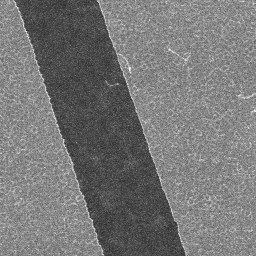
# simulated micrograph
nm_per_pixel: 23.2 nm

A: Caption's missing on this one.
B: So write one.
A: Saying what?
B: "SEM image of one or a few lines or trenches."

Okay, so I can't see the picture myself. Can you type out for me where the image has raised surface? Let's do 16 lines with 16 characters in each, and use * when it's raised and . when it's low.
*.....**********
*......*********
**.....*********
**.....*********
**......********
***.....********
***.....********
***......*******
****.....*******
****.....*******
*****.....******
*****.....******
*****.....******
******.....*****
******.....*****
******.....*****